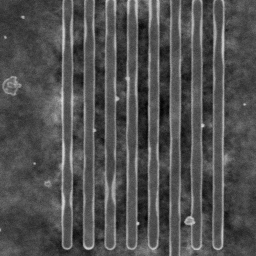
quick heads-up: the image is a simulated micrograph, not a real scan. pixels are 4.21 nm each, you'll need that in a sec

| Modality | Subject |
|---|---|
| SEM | groups of lines, slits or small figures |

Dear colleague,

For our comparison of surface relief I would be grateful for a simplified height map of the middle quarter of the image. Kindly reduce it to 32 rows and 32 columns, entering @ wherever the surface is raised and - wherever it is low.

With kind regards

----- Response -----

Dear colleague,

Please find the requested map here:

@@---@@@--@@@---@@---@@@---@@---
@@---@@@--@@@---@@---@@@---@@---
@@---@@@--@@@---@@---@@@---@@---
@@---@@@--@@@---@@---@@@---@@---
@@---@@@--@@@---@@---@@@---@@---
@@---@@@--@@@---@@---@@@---@@---
@@---@@@--@@@---@@---@@@---@@---
@@---@@@--@@@---@@---@@@---@@---
@@---@@@--@@@---@@---@@@---@@---
@@---@@@--@@@---@@---@@@---@@---
@@---@@@--@@@---@@---@@@---@@---
@@---@@@--@@@---@@---@@@---@@---
@@---@@@--@@@---@@---@@@---@@---
@@---@@@--@@@---@@---@@@---@@---
@@---@@---@@@---@@---@@@---@@---
@@---@@---@@@---@@---@@@---@@---
@@---@@@--@@@---@@---@@@---@@---
@@---@@---@@@---@@---@@@---@@---
@@---@@---@@@---@@---@@@---@@---
@@---@@---@@@---@@---@@@---@@---
@@---@@---@@@---@@---@@----@@---
@@---@@@--@@@---@@---@@----@@---
@@---@@---@@@---@@---@@----@@---
@@---@@---@@@---@@---@@----@@---
@@---@@---@@@---@@---@@@---@@---
@@---@@---@@@---@@---@@@---@@---
@@---@@---@@@---@@---@@@---@@---
@@---@@---@@@---@@---@@@---@@---
@@---@@---@@@---@@---@@@---@@---
@@---@@---@@@---@@---@@@---@@---
@@---@@----@----@@---@@@---@@---
@@---@@----@----@@---@@@---@@---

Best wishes